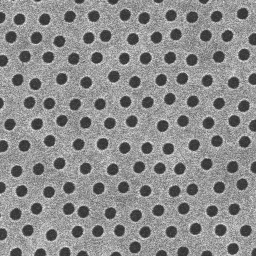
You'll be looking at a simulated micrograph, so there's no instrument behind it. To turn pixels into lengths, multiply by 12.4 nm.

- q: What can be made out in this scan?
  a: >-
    a regular array of holes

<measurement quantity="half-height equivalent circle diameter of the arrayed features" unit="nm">148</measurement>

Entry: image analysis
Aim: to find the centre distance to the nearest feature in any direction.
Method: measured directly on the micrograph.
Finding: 20.9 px